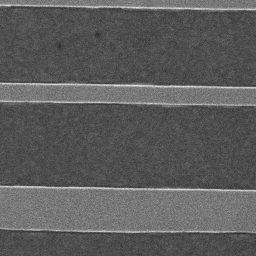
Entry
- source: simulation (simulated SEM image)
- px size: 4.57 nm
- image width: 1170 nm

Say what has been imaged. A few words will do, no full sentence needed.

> one or a few lines or trenches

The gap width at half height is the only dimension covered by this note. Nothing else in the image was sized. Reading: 371 nanometers